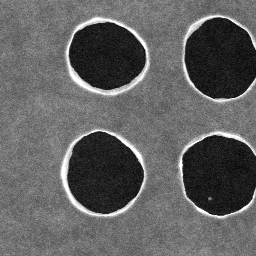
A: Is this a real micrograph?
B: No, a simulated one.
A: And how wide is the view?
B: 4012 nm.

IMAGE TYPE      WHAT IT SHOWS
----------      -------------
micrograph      holes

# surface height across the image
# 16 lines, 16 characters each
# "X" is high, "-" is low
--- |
XXXXXXXXXXXXXXXX
XXXXX--XXXXX---X
XXXX-----XXX----
XXXX-----XXX----
XXXXX----XXX----
XXXXXX--XXXX---X
XXXXXXXXXXXXXXXX
XXXXXXXXXXXXXXXX
XXXXX--XXXXXX-XX
XXXX----XXXX----
XXXX-----XX-----
XXXX-----XX-----
XXXXX---XXXX----
XXXXXXXXXXXXXXXX
XXXXXXXXXXXXXXXX
XXXXXXXXXXXXXXXX